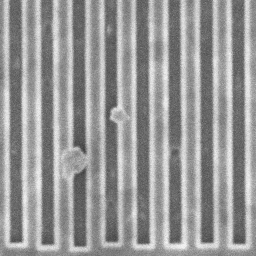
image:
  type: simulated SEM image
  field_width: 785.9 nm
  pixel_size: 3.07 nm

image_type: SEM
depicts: parallel lines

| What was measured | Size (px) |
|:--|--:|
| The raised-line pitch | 31.8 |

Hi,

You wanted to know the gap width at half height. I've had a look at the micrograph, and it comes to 51.4 nm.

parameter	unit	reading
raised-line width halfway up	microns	0.0484